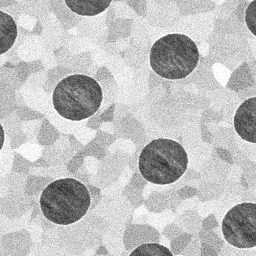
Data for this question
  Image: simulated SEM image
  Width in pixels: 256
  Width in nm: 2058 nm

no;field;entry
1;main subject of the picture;holes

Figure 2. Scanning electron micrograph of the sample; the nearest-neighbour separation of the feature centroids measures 844 nanometres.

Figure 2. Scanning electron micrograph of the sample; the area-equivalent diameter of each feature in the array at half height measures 393 nanometres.